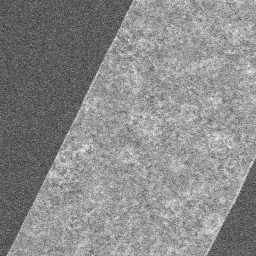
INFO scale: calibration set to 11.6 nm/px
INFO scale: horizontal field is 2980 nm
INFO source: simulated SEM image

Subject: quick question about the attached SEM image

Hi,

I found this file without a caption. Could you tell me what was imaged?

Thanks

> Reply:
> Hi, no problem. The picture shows one or a few lines or trenches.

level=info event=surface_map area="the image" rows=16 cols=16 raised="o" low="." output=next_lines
........oooooooo
........oooooooo
.......ooooooooo
.......ooooooooo
......oooooooooo
......oooooooooo
.....ooooooooooo
.....ooooooooooo
....oooooooooooo
....oooooooooooo
...ooooooooooooo
...oooooooooooo.
..ooooooooooooo.
..oooooooooooo..
.ooooooooooooo..
.oooooooooooo...